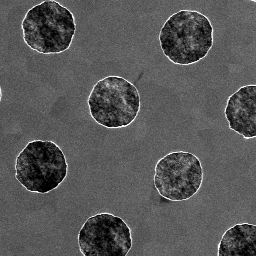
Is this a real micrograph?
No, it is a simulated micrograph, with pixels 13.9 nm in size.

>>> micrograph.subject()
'holes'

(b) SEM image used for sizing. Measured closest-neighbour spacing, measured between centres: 97.5 px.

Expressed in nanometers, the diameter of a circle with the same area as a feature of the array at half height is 700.